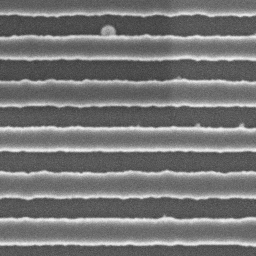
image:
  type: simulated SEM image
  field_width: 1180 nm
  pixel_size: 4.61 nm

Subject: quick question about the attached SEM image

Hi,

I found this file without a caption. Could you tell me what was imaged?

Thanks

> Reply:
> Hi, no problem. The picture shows lines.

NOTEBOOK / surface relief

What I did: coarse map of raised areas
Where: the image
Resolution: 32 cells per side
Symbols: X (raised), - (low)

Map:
XXXXXXXXXXXXXXXXXXXXXXXXXXXXXXXX
XXXXXXXXXXXXXXXXXXXXXXXXXXXXXXXX
--------------------------------
--------------------------------
---XXX--XXXXXXXX-XXXXX--X--X---X
XXXXXXXXXXXXXXXXXXXXXXXXXXXXXXXX
XXXXXXXXXXXXXXXXXXXXXXXXXXXXXXXX
-----------------XX-X-----X-X--X
--------------------------------
--------------------------------
XXXXXXXXXXXXXXXXXXXXXXXXXXXXXXXX
XXXXXXXXXXXXXXXXXXXXXXXXXXXXXXXX
XXXXXXXXXXXXXXXXXXXXXXXXXXXXXXXX
--------------------------------
--------------------------------
--------------------------------
XXXXXXXXXXXXXXXXXXXXXXXXXXXXXXXX
XXXXXXXXXXXXXXXXXXXXXXXXXXXXXXXX
XXXXXXXXXXXXXXXXXXXXXXXXXXXXXXXX
--------------------------------
--------------------------------
X----X---------XXX--XX---XX---XX
XXXXXXXXXXXXXXXXXXXXXXXXXXXXXXXX
XXXXXXXXXXXXXXXXXXXXXXXXXXXXXXXX
XXXXXXXXXXXXXXXXXXXXXXXXXXXXXXXX
--------------------------------
--------------------------------
XXXXXXXXXXXXXXXXXXXXXXXXXXXXXXXX
XXXXXXXXXXXXXXXXXXXXXXXXXXXXXXXX
XXXXXXXXXXXXXXXXXXXXXXXXXXXXXXXX
XXXXXXXXXXXXXXXXXXXXXXXXXXXXXXXX
--------------------------------